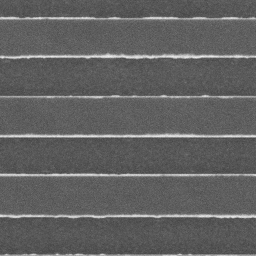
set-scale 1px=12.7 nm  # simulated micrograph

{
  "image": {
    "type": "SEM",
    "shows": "lines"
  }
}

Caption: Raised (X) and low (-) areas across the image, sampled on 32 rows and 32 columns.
--------------------------------
--------------------------------
XXXXXXXXXXXXXXXXXXXXXXXXXXXXXXXX
XXXXXXXXXXXXXXXXXXXXXXXXXXXXXXXX
XXXXXXXXXXXXXXXXXXXXXXXXXXXXXXXX
XXXXXXXXXXXXXXXXXXXXXXXXXXXXXXXX
XXXXXXXXXXXXXXXXXXXXXXXXXXXXXXXX
--------------------------------
--------------------------------
--------------------------------
--------------------------------
--------------------------------
XXXXXXXXXXXXXXXXXXXXXXXXXXXXXXXX
XXXXXXXXXXXXXXXXXXXXXXXXXXXXXXXX
XXXXXXXXXXXXXXXXXXXXXXXXXXXXXXXX
XXXXXXXXXXXXXXXXXXXXXXXXXXXXXXXX
XXXXXXXXXXXXXXXXXXXXXXXXXXXXXXXX
--------------------------------
--------------------------------
--------------------------------
--------------------------------
--------------------------------
XXXXXXXXXXXXXXXXXXXXXXXXXXXXXXXX
XXXXXXXXXXXXXXXXXXXXXXXXXXXXXXXX
XXXXXXXXXXXXXXXXXXXXXXXXXXXXXXXX
XXXXXXXXXXXXXXXXXXXXXXXXXXXXXXXX
XXXXXXXXXXXXXXXXXXXXXXXXXXXXXXXX
--------------------------------
--------------------------------
--------------------------------
--------------------------------
--------------------------------